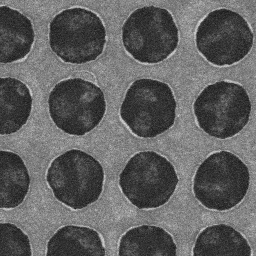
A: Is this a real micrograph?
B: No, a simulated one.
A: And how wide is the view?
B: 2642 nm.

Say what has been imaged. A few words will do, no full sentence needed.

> a regular array of holes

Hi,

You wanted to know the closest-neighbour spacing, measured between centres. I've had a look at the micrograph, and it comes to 740 nm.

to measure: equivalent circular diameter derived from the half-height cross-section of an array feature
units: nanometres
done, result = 594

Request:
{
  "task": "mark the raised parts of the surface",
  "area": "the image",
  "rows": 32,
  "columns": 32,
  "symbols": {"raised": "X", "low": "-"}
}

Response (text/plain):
XXXXXXXXXXXXXXXXXXXXXXXXXXXXXXXX
--XXXXXX----XXXX-----XXXXX---XXX
----XXX------XXX------XXX------X
----XX-------XX-------XXX------X
----XX-------XX-------XX--------
----XX-------XX-------XX--------
----XXX------XXX------XXX------X
---XXXXX----XXXXX----XXXXX----XX
XXXXXXXXXXXXXXXXXXXXXXXXXXXXXXXX
XXXXXXXXX---XXXXXXXXXXXXXXXXXXXX
---XXXX-----XXXX-----XXXXXX---XX
----XX-------XXX------XXX------X
----XX-------XX-------XX-------X
----XX-------XX-------XX-------X
----XX-------XX-------XX-------X
---XXXX-----XXXX------XXX------X
--XXXXXX---XXXXX-----XXXXX----XX
XXXXXXXXXXXXXXXXXXXXXXXXXXXXXXXX
XXXXXXXXXXXXXXXXXXXXXXXXXXXXXXXX
--XXXXX----XXXXXX---XXXXXX----XX
---XXX-------XXX-----XXXX------X
----XX-------XX-------XXX------X
----XX-------XX-------XX-------X
----XX-------XX-------XX-------X
---XXXX------XXX-----XXX-------X
--XXXXXX---XXXXXX----XXXX-----XX
XXXXXXXXXXXXXXXXXXXXXXXXXXXXXXXX
XXXXXXXXXXXXXXXXXXXXXXXXXXXXXXXX
--XXXXX----XXXXX----XXXXXX---XXX
---XXXX------XX------XXXX-----XX
----XX-------XX-------XX-------X
----XX-------XX-------XX-------X